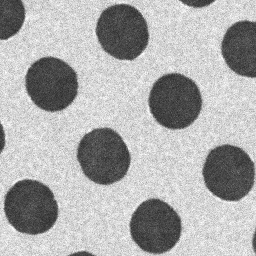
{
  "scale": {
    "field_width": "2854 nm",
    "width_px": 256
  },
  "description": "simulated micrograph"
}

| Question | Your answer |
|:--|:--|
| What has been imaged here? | holes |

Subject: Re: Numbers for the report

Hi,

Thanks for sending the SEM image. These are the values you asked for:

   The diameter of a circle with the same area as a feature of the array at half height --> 614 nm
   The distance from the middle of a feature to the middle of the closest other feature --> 0.974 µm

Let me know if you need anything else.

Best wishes